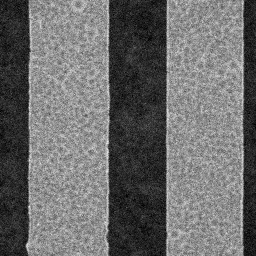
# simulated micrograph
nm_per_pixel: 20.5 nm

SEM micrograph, one or a few lines or trenches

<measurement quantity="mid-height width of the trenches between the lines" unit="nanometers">1220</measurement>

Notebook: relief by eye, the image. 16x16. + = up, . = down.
..+++++....++++.
..+++++...+++++.
..+++++...+++++.
..+++++...+++++.
..+++++...+++++.
..+++++...+++++.
..+++++...+++++.
..+++++...+++++.
..+++++...+++++.
..+++++...+++++.
..+++++...+++++.
..+++++...+++++.
..+++++...+++++.
..+++++...+++++.
..+++++...+++++.
..+++++...+++++.